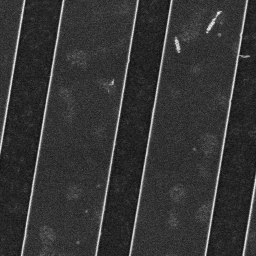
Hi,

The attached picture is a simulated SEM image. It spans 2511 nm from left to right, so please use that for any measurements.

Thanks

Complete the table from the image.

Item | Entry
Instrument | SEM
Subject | one or a few lines or trenches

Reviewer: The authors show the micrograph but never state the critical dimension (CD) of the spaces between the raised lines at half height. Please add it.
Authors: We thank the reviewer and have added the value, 329 nanometers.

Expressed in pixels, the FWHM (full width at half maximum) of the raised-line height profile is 74.7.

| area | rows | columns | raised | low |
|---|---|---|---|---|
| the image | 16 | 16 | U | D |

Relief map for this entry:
UDDDUUUUUDDUUUUD
UDDDUUUUDDUUUUUD
UDDDUUUUDDUUUUUD
UDDUUUUUDDUUUUUD
UDDUUUUUDDUUUUUD
UDDUUUUUDDUUUUUD
DDDUUUUUDDUUUUDD
DDDUUUUDDDUUUUDD
DDDUUUUDDUUUUUDD
DDUUUUUDDUUUUUDD
DDUUUUUDDUUUUUDD
DDUUUUUDDUUUUUDD
DDUUUUUDDUUUUDDD
DDUUUUDDDUUUUDDD
DDUUUUDDUUUUUDDU
DUUUUUDDUUUUUDDU